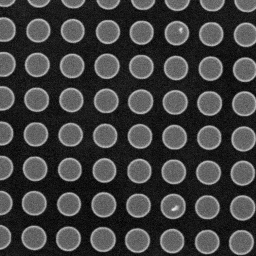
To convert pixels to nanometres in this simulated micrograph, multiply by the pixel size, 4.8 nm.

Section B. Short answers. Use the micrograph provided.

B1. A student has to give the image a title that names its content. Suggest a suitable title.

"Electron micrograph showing an array of small figures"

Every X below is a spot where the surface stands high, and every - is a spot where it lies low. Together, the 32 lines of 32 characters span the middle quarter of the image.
XXXXX---XXXXXX--XXXXXX---XXXXXX-
XXXXX---XXXXXX--XXXXXX---XXXXXX-
XXXX----XXXXX----XXXXX---XXXXXX-
----------XX------XXX------XXX--
--------------------------------
--------------------------------
XXX------XXX-------X------------
XXXX----XXXXX----XXXXX----XXXX--
XXXXX---XXXXX---XXXXXX---XXXXXX-
XXXXX---XXXXXX--XXXXXX---XXXXXX-
XXXX----XXXXX---XXXXXX---XXXXXX-
XXX------XXX-----XXXX----XXXXX--
--------------------------------
--------------------------------
--------------------------------
XXXX-----XXX------XX------XXX---
XXXX----XXXXX---XXXXXX---XXXXX--
XXXXX--XXXXXX---XXXXXX---XXXXX--
XXXX---XXXXXX---XXXXXX---XXXXXX-
XXXX----XXXXX---XXXXXX---XXXXX--
---------XXX-----XXXX-----XXXX--
--------------------------------
--------------------------------
--------------------------------
XXXX----XXXX-----XXXX-----XXX---
XXXX----XXXXX---XXXXX----XXXXX--
XXXX---XXXXXX---XXXXXX---XXXXX--
XXXX---XXXXXX---XXXXXX---XXXXX--
XXXX----XXXX----XXXXX----XXXXX--
---------XX------XXX------XXX---
--------------------------------
--------------------------------